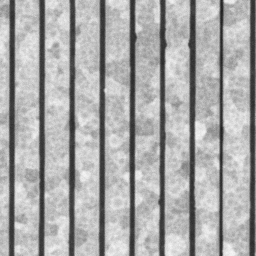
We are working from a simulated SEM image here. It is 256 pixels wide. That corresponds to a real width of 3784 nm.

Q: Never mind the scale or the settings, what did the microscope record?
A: parallel lines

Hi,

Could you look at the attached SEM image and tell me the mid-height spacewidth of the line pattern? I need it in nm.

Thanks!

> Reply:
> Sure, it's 99.8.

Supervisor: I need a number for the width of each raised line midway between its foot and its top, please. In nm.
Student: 342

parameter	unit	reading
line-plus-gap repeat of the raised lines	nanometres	442